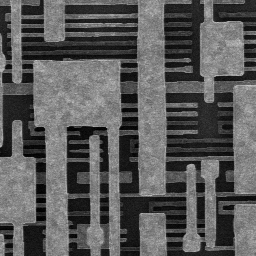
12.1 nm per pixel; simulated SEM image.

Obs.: wiring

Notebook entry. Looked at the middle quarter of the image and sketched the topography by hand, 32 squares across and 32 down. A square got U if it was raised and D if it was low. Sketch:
UUUUUUUUUUUUUUDDDDDUUUUUUDDDDDDD
UUUUUUUUUUUUUUDDDDDUUUUUUDDDDDDD
UUUUUUUUUUUUUUDDDDDUUUUUUDDDDDDD
UUUUUUUUUUUUUUDDDDDUUUUUUDDDDDDD
UUUUUUUUUUUUUUDDDDDUUUUUUDDDDDDD
UUUUUUUUUUUUUUDDDDDUUUUUUDDDDDDD
UUUUUUUUUUUUUUDDDDUUUUUUUDDDDDDD
UUUUUUUUUUUUUUDDDDDUUUUUUDDDDDDD
UUUUUUUUUUUUUUDDDDDUUUUUUDDDDDDD
UUUUUUUUUUUUUUDDDDDUUUUUUDDDDDDD
UUUUUUUUUUUUUUDDDDDUUUUUUDDDDDDD
UUUUUUUUUUUUUUDDDDDUUUUUUDDDDDDD
UUUUUUUUUUUUUUDDDDDUUUUUUDDDDDDD
UUUUUUUUUUUUUUDDDDDUUUUUUDDDDDDD
UUUUUUUUUUUUUUDDDDDUUUUUUDDDDDDD
UDDDDDDUUUUUUUDDDDDUUUUUUDDDDDDD
DDDDDDDDDDDUUUDDDDDUUUUUUDDDDDDD
DDDDDDDDDDDUUUDDDDDUUUUUUDDDDDDD
DDDDDDDUUDDUUUDDDDDUUUUUUDDDDDDD
DDDDDDDUUDDUUUDDDDDUUUUUUDDDDDDD
DDDDDDDUUDDUUUDDDDDUUUUUUDDDDDDD
DDDDDDDUUDDUUUDDDDDUUUUUUDDDDDDD
DDDDDDDUUDDUUUDDDDDUUUUUUDDDDDDD
DDDDDDDUUDDUUUDDDDDUUUUUUDDDDDDD
DDDDDDDUUDDUUUDDDDDUUUUUUDDDDDDD
DDDDDDDUUDDUUUDDDDDUUUUUUDDDDDDU
DDDDDDDUUDDUUUDDDDDUUUUUUDDDDDDU
DDDDDDDUUDDUUUDDDDDUUUUUUDDDDDDU
DDDDDDDUUDDUUUDDDDDUUUUUUDDDDDDU
DDDDDDDUUDDUUUDDDDDUUUUUUDDDDDDU
DDDDDDDUUDDUUUDDDDDUUUUUUDDDDDDU
DDDDDDDUUDDUUUDDDDDUUUUUUDDDDDDU